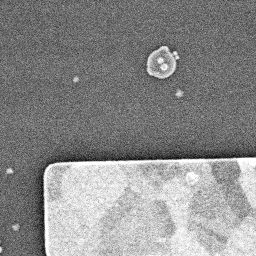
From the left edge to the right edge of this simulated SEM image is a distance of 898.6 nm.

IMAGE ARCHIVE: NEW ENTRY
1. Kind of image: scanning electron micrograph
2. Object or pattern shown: wiring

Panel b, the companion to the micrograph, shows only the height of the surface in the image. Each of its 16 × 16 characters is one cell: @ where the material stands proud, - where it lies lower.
----------------
----------------
----------------
----------------
----------------
----------------
----------------
----------------
----------------
----------------
---@@@@@@@@@@@@@
---@@@@@@@@@@@@@
---@@@@@@@@@@@@@
---@@@@@@@@@@@@@
---@@@@@@@@@@@@@
---@@@@@@@@@@@@@